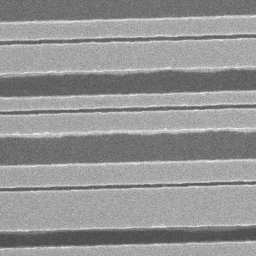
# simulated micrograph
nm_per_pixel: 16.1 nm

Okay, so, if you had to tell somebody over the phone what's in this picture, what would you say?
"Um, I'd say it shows lines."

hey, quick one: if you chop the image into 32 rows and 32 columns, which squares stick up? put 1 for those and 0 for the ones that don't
00000000000000000000000000000000
00000000000000000000000000000000
00000000000000011111111111111111
11111111111111111111111111111111
11111111111111111111111111111111
11111111111111111111111111111111
11111111111111111111111111111111
11111111111111111111111111111111
11111111111111111111111111110000
00000000000000000000000000000000
00000000000000000000000000000000
00000000000000000000000000000001
11111111111111111111111111111111
11111111111111111111111111111111
11111111111111111111111111111111
11111111111111111111111111111111
11111111111100000000000000000000
00000000000000000000000000000000
00000000000000000000000000000000
00000000000000000000000000000000
00000000000000001111111111111111
11111111111111111111111111111111
11111111111111111111111111111111
11111111111111111111111111111111
11111111111111111111111111111111
11111111111111111111111111111111
11111111111111111111111111111111
11111111111111111111111111111111
11111111111111111000000000000000
00000000000000000000000000000000
00000000000000000000000111111111
11111111111111111111111111111111